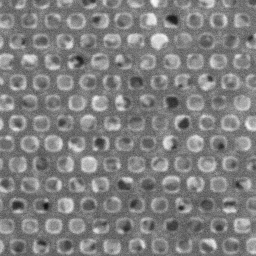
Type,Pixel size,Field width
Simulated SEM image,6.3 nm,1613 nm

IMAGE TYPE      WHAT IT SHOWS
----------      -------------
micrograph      a regular array of raised bodies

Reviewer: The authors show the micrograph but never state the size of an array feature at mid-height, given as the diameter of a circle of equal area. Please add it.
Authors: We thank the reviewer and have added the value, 96.4 nanometers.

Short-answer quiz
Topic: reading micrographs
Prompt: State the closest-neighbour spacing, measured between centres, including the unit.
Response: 146 nm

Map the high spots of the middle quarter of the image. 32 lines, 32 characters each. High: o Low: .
..ooo..oooo..oooo..ooo...oooo..o
................................
................................
oo..oooo..oooo..oooo..oooo..oooo
oo..oooo..oooo..oooo..oooo..oooo
oo..oooo..oooo..oooo..oooo..oooo
................................
................................
..ooo...oo....ooo..ooo...oooo..o
.oooo..oooo..oooo..oooo..oooo..o
.oooo..oooo..oooo..oooo..oooo..o
................................
................................
oo...oo....oo...oooo...oo...ooo.
oo..oooo..oooo..oooo..oooo..oooo
oo..oooo..oooo..oooo..oooo..oooo
.................oo.............
................................
..ooo...ooo...ooo...oo....oo...o
.oooo...ooo..oooo..oooo..oooo..o
.oooo...ooo..oooo..oooo..oooo..o
..oo....oo......................
................................
o..........oo....oo....oo....oo.
oo..oooo..oooo..oooo..oooo..oooo
oo..oooo..oooo..oooo..oooo..oooo
o....oo....oo....oo....oo....oo.
................................
................................
.oooo..oooo..oooo..oooo..oooo..o
.oooo..oooo..oooo..oooo..oooo..o
..ooo...ooo...ooo..oooo..oooo..o